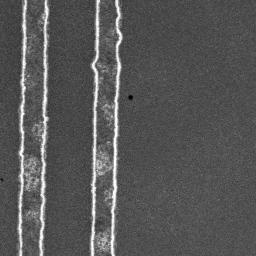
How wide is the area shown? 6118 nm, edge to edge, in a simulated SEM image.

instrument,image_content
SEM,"one or a few lines or trenches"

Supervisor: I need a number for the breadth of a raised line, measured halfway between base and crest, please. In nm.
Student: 502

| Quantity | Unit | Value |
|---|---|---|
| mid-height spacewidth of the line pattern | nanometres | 1200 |